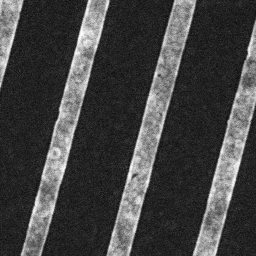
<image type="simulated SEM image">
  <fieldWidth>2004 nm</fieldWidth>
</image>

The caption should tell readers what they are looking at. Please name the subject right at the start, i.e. one or a few lines or trenches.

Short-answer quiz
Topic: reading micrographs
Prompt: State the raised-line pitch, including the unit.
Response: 652 nm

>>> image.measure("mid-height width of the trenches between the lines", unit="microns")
0.492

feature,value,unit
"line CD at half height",161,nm